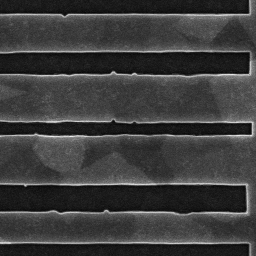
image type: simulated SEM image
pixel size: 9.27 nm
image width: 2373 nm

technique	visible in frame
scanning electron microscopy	one or a few lines or trenches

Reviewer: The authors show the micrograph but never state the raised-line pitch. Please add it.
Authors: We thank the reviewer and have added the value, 602 nm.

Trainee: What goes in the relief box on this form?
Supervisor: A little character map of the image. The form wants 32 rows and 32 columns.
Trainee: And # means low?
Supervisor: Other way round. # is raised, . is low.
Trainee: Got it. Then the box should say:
...............................#
...............................#
################################
################################
################################
################################
##.............................#
...............................#
...............................#
###################.....########
################################
################################
################################
################################
################################
...............................#
...............................#
################################
################################
################################
################################
################################
################################
...............................#
...............................#
...............................#
......#......#.................#
###############################.
################################
################################
...............................#
...............................#